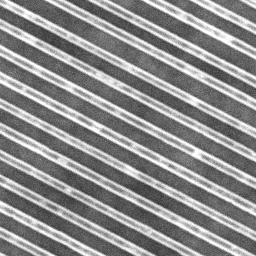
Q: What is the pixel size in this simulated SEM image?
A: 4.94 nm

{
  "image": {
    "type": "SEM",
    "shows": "parallel lines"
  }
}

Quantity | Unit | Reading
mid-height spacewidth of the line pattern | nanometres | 75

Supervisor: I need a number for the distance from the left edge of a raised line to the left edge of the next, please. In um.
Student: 0.113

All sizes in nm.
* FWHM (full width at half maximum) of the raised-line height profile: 39.4